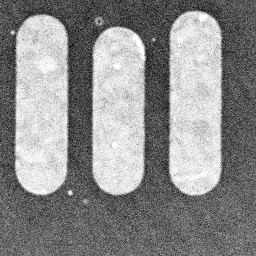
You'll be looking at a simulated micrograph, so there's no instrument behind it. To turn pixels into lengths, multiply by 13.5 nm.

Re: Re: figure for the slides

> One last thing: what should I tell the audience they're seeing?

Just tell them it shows groups of lines, slits or small figures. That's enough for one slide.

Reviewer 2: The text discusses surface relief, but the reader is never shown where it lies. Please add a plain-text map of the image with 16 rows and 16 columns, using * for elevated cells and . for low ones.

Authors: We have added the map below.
................
..**.......***..
.***..***..***..
.***..***..***..
.***..***..***..
.***..***..***..
.***..***..***..
.***..***..***..
.***..***..***..
.***..***..***..
.***..***..***..
.***..***..**...
................
................
................
................